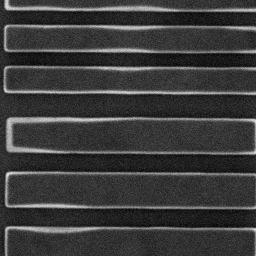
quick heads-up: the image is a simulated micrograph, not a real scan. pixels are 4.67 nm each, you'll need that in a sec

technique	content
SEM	groups of lines, slits or small figures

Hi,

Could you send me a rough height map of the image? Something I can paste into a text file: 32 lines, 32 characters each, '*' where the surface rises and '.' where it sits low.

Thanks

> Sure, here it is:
.*******************************
................................
................................
.***************..************..
.*******************************
.*******************************
......................*****.....
................................
.*************....*********.***.
.*******************************
.*******************************
.*******************************
................................
................................
................................
.*******************************
.*******************************
.*******************************
.*******************************
................................
................................
................................
.*******************************
.*******************************
.*******************************
.*******************************
................................
................................
.**........***********..........
.*******************************
.*******************************
.*******************************